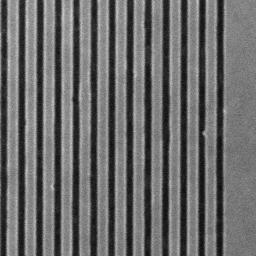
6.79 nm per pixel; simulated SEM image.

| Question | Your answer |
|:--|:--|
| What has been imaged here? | parallel lines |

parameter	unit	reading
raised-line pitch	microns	0.122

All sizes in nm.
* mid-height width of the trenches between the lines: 56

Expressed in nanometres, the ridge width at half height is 67.9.